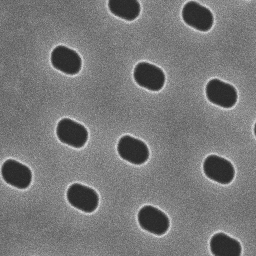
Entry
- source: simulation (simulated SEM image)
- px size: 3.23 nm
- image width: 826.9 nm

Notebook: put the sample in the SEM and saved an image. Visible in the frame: a regular array of holes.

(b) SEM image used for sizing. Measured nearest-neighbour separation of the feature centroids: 236 nm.